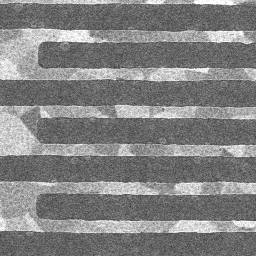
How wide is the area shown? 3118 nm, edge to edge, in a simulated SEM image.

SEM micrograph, parallel lines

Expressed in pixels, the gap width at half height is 26.8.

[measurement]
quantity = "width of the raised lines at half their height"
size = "131 nm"